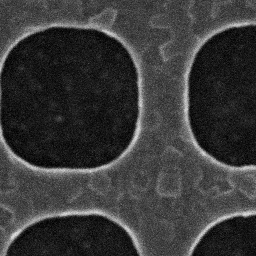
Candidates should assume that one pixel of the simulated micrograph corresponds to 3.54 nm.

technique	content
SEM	holes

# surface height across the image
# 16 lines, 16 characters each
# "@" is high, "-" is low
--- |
@@@@@@@@@@@@@@@@
@@@@@@@@@@@@@@@@
@------@@@@@@---
--------@@@@----
---------@@@----
---------@@@----
---------@@@----
---------@@@----
--------@@@@----
@-------@@@@@---
@@@---@@@@@@@@@@
@@@@@@@@@@@@@@@@
@@@@@@@@@@@@@@@@
@@@@---@@@@@@@@-
@-------@@@@@---
---------@@@----